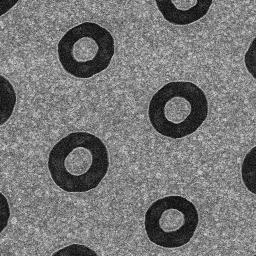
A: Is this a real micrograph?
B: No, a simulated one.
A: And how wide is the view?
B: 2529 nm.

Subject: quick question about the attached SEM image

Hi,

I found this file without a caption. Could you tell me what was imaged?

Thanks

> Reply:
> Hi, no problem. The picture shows ring-shaped grooves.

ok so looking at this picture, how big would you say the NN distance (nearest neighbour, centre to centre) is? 1.08 microns